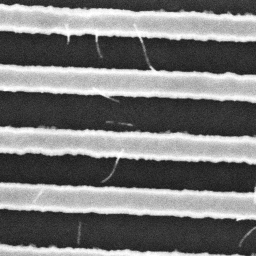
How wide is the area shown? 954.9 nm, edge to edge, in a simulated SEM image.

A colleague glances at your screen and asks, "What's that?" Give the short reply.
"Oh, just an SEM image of lines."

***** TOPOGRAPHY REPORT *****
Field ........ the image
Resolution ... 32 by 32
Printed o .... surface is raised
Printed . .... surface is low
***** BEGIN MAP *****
................................
oooooooooooooooo................
oooooooooooooooooooooooooooooooo
oooooooooooooooooooooooooooooooo
................oooooooooooooooo
................................
................................
................................
oooooooooo......................
oooooooooooooooooooooooooooooo..
oooooooooooooooooooooooooooooooo
......oooooooooooooooooooooooooo
...............................o
................................
................................
................................
ooooooooooooo...................
oooooooooooooooooooooooooooooooo
oooooooooooooooooooooooooooooooo
............oooooooooooooooooooo
................................
................................
................................
ooooooooooooooo.................
oooooooooooooooooooooooooooooooo
oooooooooooooooooooooooooooooooo
..........o.oooooooooooooooooooo
................................
................................
................................
................................
ooooooooooooooooo...............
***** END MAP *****